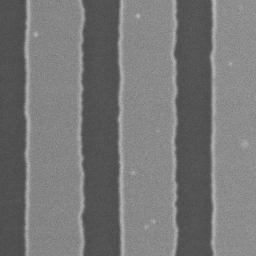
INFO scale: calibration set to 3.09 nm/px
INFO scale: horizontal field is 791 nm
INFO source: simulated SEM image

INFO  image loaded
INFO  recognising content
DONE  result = lines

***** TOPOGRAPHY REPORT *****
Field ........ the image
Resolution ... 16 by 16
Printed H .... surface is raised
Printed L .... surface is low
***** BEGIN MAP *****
LLHHHLLLHHHLLHHH
LLHHHLLHHHHLLHHH
LLHHHLLHHHHLLHHH
LLHHHLLHHHHLLHHH
LLHHHLLLHHHLLHHH
LLHHHLLHHHHLLHHH
LLHHHLLHHHHLLHHH
LLHHHLLHHHHLLHHH
LLHHHLLHHHHLLHHH
LLHHHLLHHHHLLHHH
LLHHHLLLHHHLLHHH
LLHHHLLHHHHLLHHH
LLHHHLLLHHHLLHHH
LLHHHLLLHHHLLHHH
LLHHHLLLHHHLLHHH
LLHHHLLLHHHLLHHH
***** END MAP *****